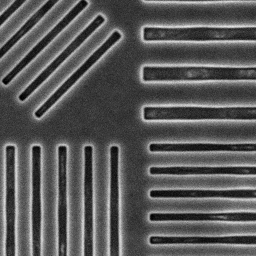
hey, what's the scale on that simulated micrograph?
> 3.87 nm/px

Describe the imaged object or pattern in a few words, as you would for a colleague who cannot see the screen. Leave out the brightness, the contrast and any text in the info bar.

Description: groups of lines, slits or small figures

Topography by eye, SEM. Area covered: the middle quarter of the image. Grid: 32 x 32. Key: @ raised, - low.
@@@@---@@@@@@@@@@@@@------------
@@@---@@@@@@@@@@@@@-------------
@@---@@@@@@@@@@@@@@-------------
@---@@@@@@@@@@@@@@@-------------
---@@@@@@@@@@@@@@@@@-----------@
--@@@@@@@@@@@@@@@@@@@@@@@@@@@@@@
-@@@@@@@@@@@@@@@@@@@@@@@@@@@@@@@
@@@@@@@@@@@@@@@@@@@@@@@@@@@@@@@@
@@@@@@@@@@@@@@@@@@@@@@@@@@@@@@@@
@@@@@@@@@@@@@@@@@@@@@@@@@@@@@@@@
@@@@@@@@@@@@@@@@@@@@------------
@@@@@@@@@@@@@@@@@@@@------------
@@@@@@@@@@@@@@@@@@@@------------
@@@@@@@@@@@@@@@@@@@@------------
@@@@@@@@@@@@@@@@@@@@@@@@@@@@@@@@
@@@@@@@@@@@@@@@@@@@@@@@@@@@@@@@@
@@@@@@@@@@@@@@@@@@@@@@@@@@@@@@@@
@@@@@@@@@@@@@@@@@@@@@@@@@@@@@@@@
@@@@@@@@@@@@@@@@@@@@@@@@@@@@@@@@
@@@@@@@@@@@@@@@@@@@@@@@@@@@@@@@@
-@@@@--@@@@@-@@@@@@@@-----------
-@@@@--@@@@---@@@@@@@-----------
-@@@@--@@@@---@@@@@@@@@@@@@@@@@@
-@@@@--@@@@---@@@@@@@@@@@@@@@@@@
-@@@@--@@@@---@@@@@@@@@@@@@@@@@@
-@@@@--@@@@---@@@@@@@@@@@@@-----
-@@@@--@@@@---@@@@@@@-----------
-@@@@--@@@@---@@@@@@@@----------
-@@@@--@@@@---@@@@@@@@@@@@@@@@@@
-@@@@--@@@@---@@@@@@@@@@@@@@@@@@
-@@@@--@@@@---@@@@@@@@@@@@@@@@@@
-@@@@--@@@@---@@@@@@@@----------